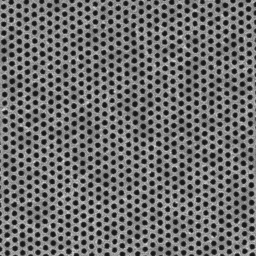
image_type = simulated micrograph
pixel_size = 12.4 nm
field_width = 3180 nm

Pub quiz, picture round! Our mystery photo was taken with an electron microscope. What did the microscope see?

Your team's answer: a regular array of holes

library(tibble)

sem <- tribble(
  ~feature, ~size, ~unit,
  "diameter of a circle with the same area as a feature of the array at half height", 72.8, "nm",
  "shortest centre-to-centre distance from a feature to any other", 8.57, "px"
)